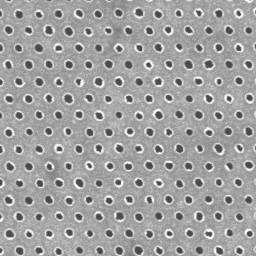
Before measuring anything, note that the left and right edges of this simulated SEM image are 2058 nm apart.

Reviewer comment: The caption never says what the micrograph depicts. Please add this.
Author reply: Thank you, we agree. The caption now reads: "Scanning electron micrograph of a regular array of holes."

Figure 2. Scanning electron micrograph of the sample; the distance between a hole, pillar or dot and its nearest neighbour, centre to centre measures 152 nm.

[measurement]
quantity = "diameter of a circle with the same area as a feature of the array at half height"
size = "52.9 nm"